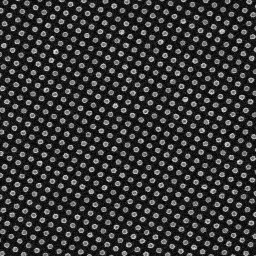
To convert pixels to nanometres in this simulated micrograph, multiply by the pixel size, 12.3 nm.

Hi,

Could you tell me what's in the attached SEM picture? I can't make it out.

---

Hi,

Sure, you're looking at a regular array of raised bodies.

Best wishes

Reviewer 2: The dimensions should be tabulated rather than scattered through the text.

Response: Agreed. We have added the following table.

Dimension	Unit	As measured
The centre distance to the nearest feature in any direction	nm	116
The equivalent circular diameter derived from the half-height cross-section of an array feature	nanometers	63.6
